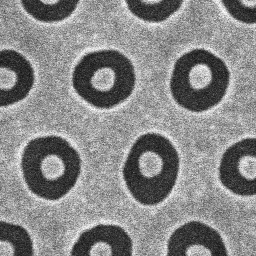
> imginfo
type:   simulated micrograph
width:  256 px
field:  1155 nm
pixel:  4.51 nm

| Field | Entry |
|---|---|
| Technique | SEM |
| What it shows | ring-shaped grooves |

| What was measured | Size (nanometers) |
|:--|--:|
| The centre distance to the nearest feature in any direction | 440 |